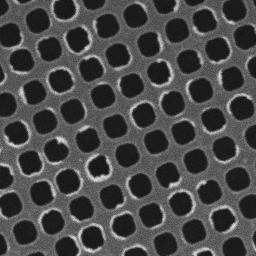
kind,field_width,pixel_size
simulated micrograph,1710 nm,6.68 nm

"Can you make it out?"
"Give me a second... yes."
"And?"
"a regular array of holes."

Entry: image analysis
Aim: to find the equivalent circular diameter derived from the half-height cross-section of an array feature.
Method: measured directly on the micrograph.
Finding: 161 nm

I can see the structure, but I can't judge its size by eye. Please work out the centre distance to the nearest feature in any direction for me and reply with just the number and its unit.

198 nm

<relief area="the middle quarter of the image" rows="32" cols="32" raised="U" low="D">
UUUUDDDDDDUUDDDUUUUUUDDDDDUUUDDD
UUUUDDDDDDUUUUUUUUUUUDDDDDUUUDDD
DUUUDDDDDDUUUUUUDDUUUDDDDDDUUUUU
DDUUUDDDDUUUUUDDDDDUUDDDDDUUUUUU
DDUUUUUUUUUUUUDDDDDDUUDDDDUUUUUU
DDUUUUUUDDDDUUDDDDDDUUUUUUUUUUUD
DUUUUUUDDDDDUUDDDDDDUUUUUUUUUUUD
UUUUUUUDDDDDDUUDDDDUUUUUUDDDDUUU
UUUUUUUDDDDDDUUUDUUUUUUUUDDDDDUU
UDDDUUUDDDDDDUUUUUUUUUUUDDDDDDUU
DDDDDUUUDDDUUUUUUUDDDDUUDDDDDDUU
DDDDDUUUUUUUUUUUUDDDDDDUUDDDDDUU
DDDDDUUUUUUUUDUUUDDDDDDUUUDDUUUU
DDDDDUUUUUDDDDDUUDDDDDDUUUUUUUUU
UDDUUUUUUUDDDDDDUUDDDDDUUUUUUDDU
UUUUUUUUUUDDDDDDUUDDDUUUUUUDDDDD
UUUUUDDDUUDDDDDDUUUUUUUDUUUDDDDD
UUUDDDDDUUDDDDDUUUUUUDDDDUUDDDDD
UUUDDDDDDUUDDUUUUUUUDDDDDUUDDDDD
UUUDDDDDDUUUUUUUUUUUDDDDDDUUDDDD
DUUDDDDDDUUUUUDDDDUUDDDDDDUUUUUU
DUUUDDDDUUUUUDDDDDUUUDDDDUUUUUUU
DUUUUUUUUUUUUDDDDDDUUUDDUUUUUUDD
UUUUUUUUDDUUUDDDDDDUUUUUUUUUUUDD
UUUUUUDDDDDUUDDDDDUUUUUUUUDUUUDD
UUUUUUDDDDDUUUDDDUUUUUUUDDDDUUDD
DDUUUUDDDDDUUUUUUUUUUUUDDDDDDUUD
DDDUUUUDDDDUUUUUUUUDUUUDDDDDDUUU
DDDDUUUUUUUUUUUUUDDDDUUDDDDDDUUU
DDDDUUUUUUUUUUUUDDDDDDUUDDDDUUUU
DDDDUUUUUUUDDDUUDDDDDDUUDDUUUUUU
DDDUUUUUUDDDDDUUUDDDDDUUUUUUUUUU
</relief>